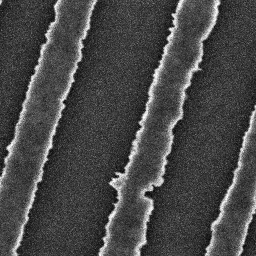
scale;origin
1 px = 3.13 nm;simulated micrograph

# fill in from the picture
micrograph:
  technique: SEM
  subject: one or a few lines or trenches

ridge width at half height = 112 nm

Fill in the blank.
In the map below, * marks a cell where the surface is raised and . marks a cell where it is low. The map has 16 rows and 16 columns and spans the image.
...***.....***..
...***.....**...
...**......**...
...**.....***...
..***.....**....
..**.....***....
..**.....**.....
.***.....**.....
.**......**....*
.**.....***....*
***.....**.....*
**.....***.....*
**.....**.....**
**.....**.....**
*......**....**.
*.....***....**.